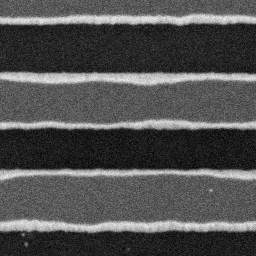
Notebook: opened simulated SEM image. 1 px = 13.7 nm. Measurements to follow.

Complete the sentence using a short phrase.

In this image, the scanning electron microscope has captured lines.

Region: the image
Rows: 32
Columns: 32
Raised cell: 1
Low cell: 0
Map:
11111111111111111111111111111111
11111111111111111111111111111111
11111111111111111111111101111111
00000000000000000000000000000000
00000000000000000000000000000000
00000000000000000000000000000000
00000000000000000000000000000000
00000000000000000000000000000000
00000000000000000000000000000000
11100000000110000000000101111100
11111111111111111111111111111111
11111111111111111111111111111111
11111111111111111111111111111111
11111111111111111111111111111111
11111111111111111111111111111111
11111111111111111111111111111111
00000000000000000000000000000000
00000000000000000000000000000000
00000000000000000000000000000000
00000000000000000000000000000000
00000000000000000000000000000000
00001001100010001110111011100000
11111111111111111111111111111111
11111111111111111111111111111111
11111111111111111111111111111111
11111111111111111111111111111111
11111111111111111111111111111111
11111111111111111111111111111111
00000000111110101111000111001110
00000000000000000000000000000000
00000000000000000000000000000000
00000000000000000000000000000000